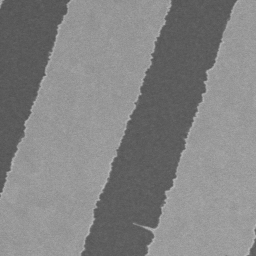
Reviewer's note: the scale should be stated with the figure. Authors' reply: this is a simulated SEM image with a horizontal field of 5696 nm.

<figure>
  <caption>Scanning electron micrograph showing one or a few lines or trenches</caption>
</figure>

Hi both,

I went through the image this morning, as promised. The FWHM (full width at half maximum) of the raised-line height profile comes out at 2110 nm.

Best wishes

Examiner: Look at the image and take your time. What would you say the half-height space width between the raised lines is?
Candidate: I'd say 1.35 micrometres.